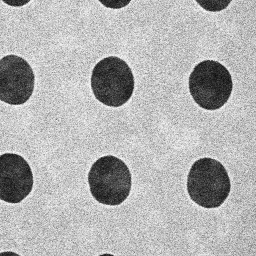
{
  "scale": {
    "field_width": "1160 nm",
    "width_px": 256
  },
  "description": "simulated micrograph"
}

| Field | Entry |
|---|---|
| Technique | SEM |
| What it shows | holes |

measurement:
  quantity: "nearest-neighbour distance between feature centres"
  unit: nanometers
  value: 445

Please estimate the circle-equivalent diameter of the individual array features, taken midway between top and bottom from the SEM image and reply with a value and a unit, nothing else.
211 nm